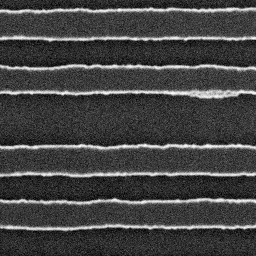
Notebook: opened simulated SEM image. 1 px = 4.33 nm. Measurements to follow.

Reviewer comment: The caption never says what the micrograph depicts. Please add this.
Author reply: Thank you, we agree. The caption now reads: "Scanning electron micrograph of lines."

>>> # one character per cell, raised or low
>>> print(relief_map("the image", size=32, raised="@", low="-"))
--------------------------------
@@@@@@@@@@@@@@@@@@@@@@@@@@@@@@@@
@@@@@@@@@@@@@@@@@@@@@@@@@@@@@@@@
@@@@@@@@@@@@@@@@@@@@@@@@@@@@@@@@
@@@@@@@@@@@@@@@@@@@@@@@@@@@@@@@@
--------------------------------
--------------------------------
--------------------------------
@@@@--@@@@@@@@@@@@@@@@@@@@@@@@--
@@@@@@@@@@@@@@@@@@@@@@@@@@@@@@@@
@@@@@@@@@@@@@@@@@@@@@@@@@@@@@@@@
@@@@@@@@@@@@@@@@@@@@@@@@@@@@@@@@
--------------------------------
--------------------------------
--------------------------------
--------------------------------
--------------------------------
--------------------------------
@@@@@@@@@@@@@@@@@@@@@@@@@@@@@@@@
@@@@@@@@@@@@@@@@@@@@@@@@@@@@@@@@
@@@@@@@@@@@@@@@@@@@@@@@@@@@@@@@@
@@@@@@@@@@@@@@@@@@@@@@@@@@@@@@@@
--------------------------------
--------------------------------
--------------------------------
@@@@@@@@@@@@@@@@@@@@@@@@@@@@@@@@
@@@@@@@@@@@@@@@@@@@@@@@@@@@@@@@@
@@@@@@@@@@@@@@@@@@@@@@@@@@@@@@@@
--@@@@@@@@@-------@---------@@--
--------------------------------
--------------------------------
--------------------------------